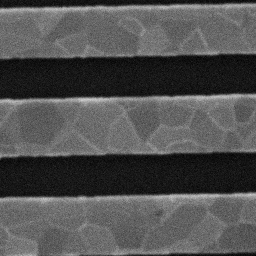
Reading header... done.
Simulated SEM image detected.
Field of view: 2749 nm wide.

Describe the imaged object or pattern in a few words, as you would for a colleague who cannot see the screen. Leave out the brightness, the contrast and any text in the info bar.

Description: lines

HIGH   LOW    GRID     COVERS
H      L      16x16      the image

LLLLLHHHHHHHHHHH
HHHHHHHHHHHHHHHH
HHHHHHHHHHHHHHHH
HHHHHHLLLLLLLLLL
LLLLLLLLLLLLLLLL
LLLLLLLLLLLLLLLL
HHHHHHHHHHHHHHHH
HHHHHHHHHHHHHHHH
HHHHHHHHHHHHHHHH
HHHHHHHHHHHHHHLL
LLLLLLLLLLLLLLLL
LLLLLLLLLLLLLLLL
HHHHHHHHHHHHHHHH
HHHHHHHHHHHHHHHH
HHHHHHHHHHHHHHHH
HHHHHHHHHHHHHHHH